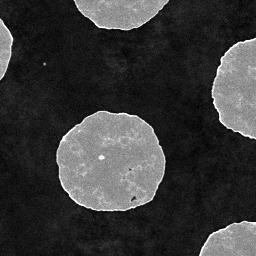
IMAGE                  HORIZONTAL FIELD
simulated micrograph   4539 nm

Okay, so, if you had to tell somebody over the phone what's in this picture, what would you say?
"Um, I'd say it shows raised bodies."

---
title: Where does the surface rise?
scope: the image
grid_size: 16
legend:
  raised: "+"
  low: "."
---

.....+++++......
......+++.......
+...............
+.............++
..............++
.............+++
.............+++
.....++++.....++
....++++++.....+
....++++++......
....++++++......
....++++++......
.....++++.......
................
..............++
.............+++